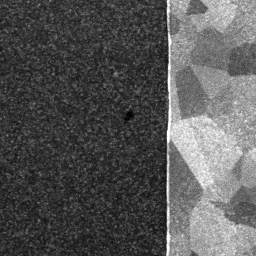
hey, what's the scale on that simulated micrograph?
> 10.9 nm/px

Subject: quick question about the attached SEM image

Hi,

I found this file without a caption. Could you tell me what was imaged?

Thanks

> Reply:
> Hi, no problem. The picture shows one or a few lines or trenches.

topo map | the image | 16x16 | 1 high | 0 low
0000000000011111
0000000000011111
0000000000011111
0000000000011111
0000000000011111
0000000000011111
0000000000011111
0000000000011111
0000000000111111
0000000000111111
0000000000111111
0000000000111111
0000000000111111
0000000000111111
0000000000111111
0000000000111111